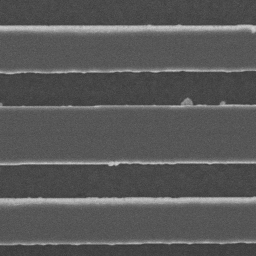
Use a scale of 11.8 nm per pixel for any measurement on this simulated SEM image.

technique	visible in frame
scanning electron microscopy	lines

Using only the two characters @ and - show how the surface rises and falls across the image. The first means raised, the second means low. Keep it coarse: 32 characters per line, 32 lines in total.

--------------------------------
--------------------------------
--------------------------------
@@@@@@@@@@@@@@@@@@@@@@@@@@@@@@@@
@@@@@@@@@@@@@@@@@@@@@@@@@@@@@@@@
@@@@@@@@@@@@@@@@@@@@@@@@@@@@@@@@
@@@@@@@@@@@@@@@@@@@@@@@@@@@@@@@@
@@@@@@@@@@@@@@@@@@@@@@@@@@@@@@@@
@@@@@@@@@@@@@@@@@@@@@@@@@@@@@@@@
--------------------------------
--------------------------------
--------------------------------
--------------------------------
@@@@@@@@@@@@@@@@@@@@@@@@@@@@@@@@
@@@@@@@@@@@@@@@@@@@@@@@@@@@@@@@@
@@@@@@@@@@@@@@@@@@@@@@@@@@@@@@@@
@@@@@@@@@@@@@@@@@@@@@@@@@@@@@@@@
@@@@@@@@@@@@@@@@@@@@@@@@@@@@@@@@
@@@@@@@@@@@@@@@@@@@@@@@@@@@@@@@@
@@@@@@@@@@@@@@@@@@@@@@@@@@@@@@@@
@@@----------@@-----------------
--------------------------------
--------------------------------
--------------------------------
--------------------------------
@@@@@@@@@@@@@@@@@@@@@@@@@@@@@@@@
@@@@@@@@@@@@@@@@@@@@@@@@@@@@@@@@
@@@@@@@@@@@@@@@@@@@@@@@@@@@@@@@@
@@@@@@@@@@@@@@@@@@@@@@@@@@@@@@@@
@@@@@@@@@@@@@@@@@@@@@@@@@@@@@@@@
@@@@@@@--@---@@-----------------
--------------------------------